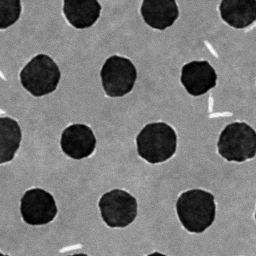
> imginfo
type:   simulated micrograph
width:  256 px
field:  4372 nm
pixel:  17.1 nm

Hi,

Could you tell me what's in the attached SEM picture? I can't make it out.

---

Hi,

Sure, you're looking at a regular array of holes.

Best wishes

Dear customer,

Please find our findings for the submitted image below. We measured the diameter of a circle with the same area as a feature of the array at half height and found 659 nanometers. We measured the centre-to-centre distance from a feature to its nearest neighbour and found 1310 nm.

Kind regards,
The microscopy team